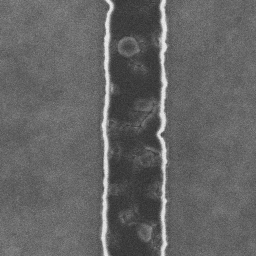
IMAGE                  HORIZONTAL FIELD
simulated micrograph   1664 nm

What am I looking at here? one or a few lines or trenches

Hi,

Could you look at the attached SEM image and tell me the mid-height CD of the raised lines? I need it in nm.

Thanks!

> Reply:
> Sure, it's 380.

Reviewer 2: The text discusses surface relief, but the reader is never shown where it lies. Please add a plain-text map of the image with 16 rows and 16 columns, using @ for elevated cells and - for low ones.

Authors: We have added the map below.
-------@@@------
-------@@@------
-------@@@------
-------@@@------
-------@@@------
-------@@@------
-------@@@------
-------@@@------
-------@@@------
-------@@@------
-------@@@------
-------@@@------
------@@@@------
------@@@@------
------@@@@------
-------@@@------